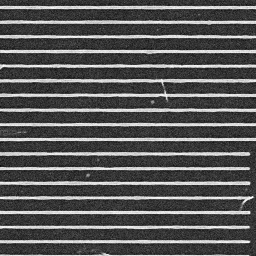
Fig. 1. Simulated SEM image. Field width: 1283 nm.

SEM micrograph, parallel lines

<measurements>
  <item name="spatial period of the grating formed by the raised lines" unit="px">14.6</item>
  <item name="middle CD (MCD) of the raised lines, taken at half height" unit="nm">14.4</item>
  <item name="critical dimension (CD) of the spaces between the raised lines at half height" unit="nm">60.8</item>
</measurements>